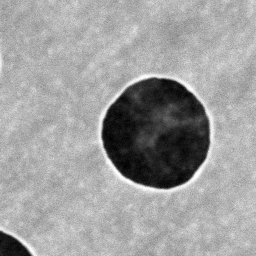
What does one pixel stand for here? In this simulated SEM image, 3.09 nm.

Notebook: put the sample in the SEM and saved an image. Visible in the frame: holes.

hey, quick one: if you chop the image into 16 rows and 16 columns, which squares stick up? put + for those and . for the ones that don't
++++++++++++++++
++++++++++++++++
++++++++++++++++
++++++++++++++++
++++++++++++++++
++++++++....++++
+++++++......+++
++++++.......+++
++++++.......+++
+++++++......+++
+++++++.....++++
+++++++++..+++++
++++++++++++++++
++++++++++++++++
++++++++++++++++
..++++++++++++++